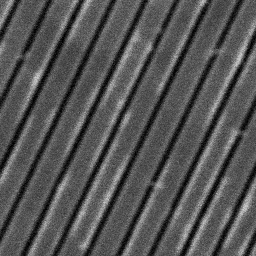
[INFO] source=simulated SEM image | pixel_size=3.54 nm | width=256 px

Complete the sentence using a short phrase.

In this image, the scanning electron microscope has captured parallel lines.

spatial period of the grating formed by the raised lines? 102 nm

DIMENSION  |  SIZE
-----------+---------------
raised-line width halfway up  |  0.0738 um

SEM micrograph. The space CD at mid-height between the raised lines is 26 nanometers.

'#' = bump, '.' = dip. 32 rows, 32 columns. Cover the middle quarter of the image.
###...#####...######.######..###
###..######..######..######..###
##...#####...######.######..####
##..######..######..######..####
##..#####...#####..######...####
#..######..######..######..#####
#..######..#####...#####...#####
..######..######..######..######
..######..#####...#####...#####.
.######..######..######..######.
.#####...#####...#####...#####..
.#####..######..######..######..
#####...######.######...#####...
#####..######..######..######..#
#####..######..#####...#####...#
####..######..######..######..##
####..######..#####...#####...##
###..######..######..######..###
###..######..#####...######..###
##...#####..######..######..####
##..######..######..######..####
#...#####..######..######..#####
#..######..######..######..#####
...#####..######..######..######
..######..######..######..######
..#####..######..######...#####.
.######..######..######..######.
.#####..######...#####..######..
######..######..######..######..
#####...#####...#####..######...
#####..######..######..######..#
####...#####...#####..######...#